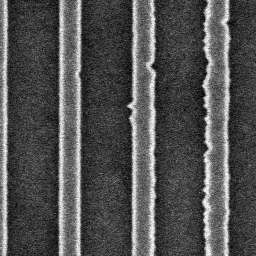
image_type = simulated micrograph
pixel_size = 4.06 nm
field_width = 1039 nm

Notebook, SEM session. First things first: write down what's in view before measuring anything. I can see one or a few lines or trenches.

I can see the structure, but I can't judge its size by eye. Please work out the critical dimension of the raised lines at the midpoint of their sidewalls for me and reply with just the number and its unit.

73.6 nm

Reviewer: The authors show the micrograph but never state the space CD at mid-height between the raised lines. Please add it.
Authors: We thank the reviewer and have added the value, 224 nanometres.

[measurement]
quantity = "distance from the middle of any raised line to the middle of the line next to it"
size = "0.298 microns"